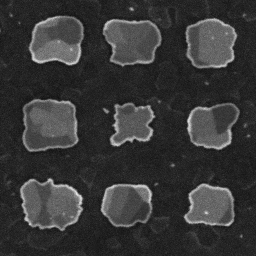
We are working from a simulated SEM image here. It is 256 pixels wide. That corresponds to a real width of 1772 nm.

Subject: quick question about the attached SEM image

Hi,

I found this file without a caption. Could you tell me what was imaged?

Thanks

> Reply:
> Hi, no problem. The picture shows a regular array of raised bodies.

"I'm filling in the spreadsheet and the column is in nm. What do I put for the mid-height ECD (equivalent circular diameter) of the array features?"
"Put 348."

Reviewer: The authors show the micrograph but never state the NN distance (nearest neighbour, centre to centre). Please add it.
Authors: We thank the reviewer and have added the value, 544 nanometers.